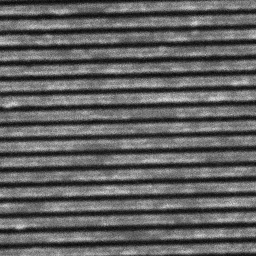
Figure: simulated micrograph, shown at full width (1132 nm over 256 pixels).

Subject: parallel lines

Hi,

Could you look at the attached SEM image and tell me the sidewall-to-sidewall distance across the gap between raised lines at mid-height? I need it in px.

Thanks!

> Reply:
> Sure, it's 6.38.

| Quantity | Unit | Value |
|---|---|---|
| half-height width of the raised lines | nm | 39.2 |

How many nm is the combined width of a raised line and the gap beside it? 67.3